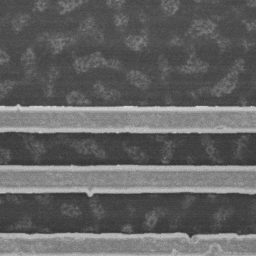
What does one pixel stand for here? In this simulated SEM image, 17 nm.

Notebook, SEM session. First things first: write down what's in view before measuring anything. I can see one or a few lines or trenches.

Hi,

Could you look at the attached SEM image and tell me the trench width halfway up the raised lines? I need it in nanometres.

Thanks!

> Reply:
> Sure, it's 684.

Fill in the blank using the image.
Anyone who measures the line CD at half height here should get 389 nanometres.